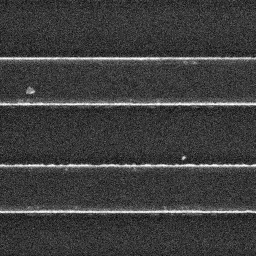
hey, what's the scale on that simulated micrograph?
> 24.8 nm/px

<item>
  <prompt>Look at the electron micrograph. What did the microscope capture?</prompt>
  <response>lines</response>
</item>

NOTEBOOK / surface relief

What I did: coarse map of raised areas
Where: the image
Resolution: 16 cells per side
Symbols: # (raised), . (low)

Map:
................
................
................
................
################
################
################
................
................
................
################
################
################
................
................
................